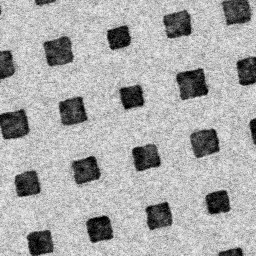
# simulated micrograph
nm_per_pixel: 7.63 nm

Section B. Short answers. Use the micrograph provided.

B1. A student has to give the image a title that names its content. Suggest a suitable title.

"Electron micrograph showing a regular array of holes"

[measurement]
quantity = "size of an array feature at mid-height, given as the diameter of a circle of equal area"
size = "213 nanometres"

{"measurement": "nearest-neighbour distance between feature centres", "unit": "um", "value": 0.46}